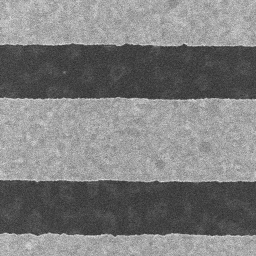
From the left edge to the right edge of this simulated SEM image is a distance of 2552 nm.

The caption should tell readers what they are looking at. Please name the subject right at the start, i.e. one or a few lines or trenches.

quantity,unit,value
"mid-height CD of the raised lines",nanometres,815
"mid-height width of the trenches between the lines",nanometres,541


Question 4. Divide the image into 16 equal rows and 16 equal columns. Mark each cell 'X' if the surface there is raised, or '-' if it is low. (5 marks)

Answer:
XXXXXXXXXXXXXXXX
XXXXXXXXXXXXXXXX
XXXXXXXXXXXXXXXX
----------------
----------------
----------------
XXXXXXXXXXXXXXXX
XXXXXXXXXXXXXXXX
XXXXXXXXXXXXXXXX
XXXXXXXXXXXXXXXX
XXXXXXXXXXXXXXXX
----------------
----------------
----------------
----------------
XXXXXXXXXXXXXXXX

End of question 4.